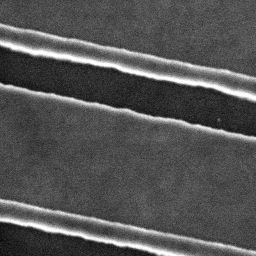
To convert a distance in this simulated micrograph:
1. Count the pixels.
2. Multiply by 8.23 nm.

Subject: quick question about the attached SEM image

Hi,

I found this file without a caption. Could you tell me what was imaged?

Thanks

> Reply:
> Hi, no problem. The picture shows lines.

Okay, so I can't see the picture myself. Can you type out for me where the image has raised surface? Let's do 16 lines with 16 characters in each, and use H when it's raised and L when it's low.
HHHHHHHHHHHHHHHH
HHHHHHHHHHHHHHHH
HHHHHHHHHHHHHHHH
LLLLHHHHHHHHHHHH
LLLLLLLLHHHHHHHH
HLLLLLLLLLLLLLHH
HHHHHHLLLLLLLLLL
HHHHHHHHHHHLLLLL
HHHHHHHHHHHHHHHL
HHHHHHHHHHHHHHHH
HHHHHHHHHHHHHHHH
HHHHHHHHHHHHHHHH
HHHHHHHHHHHHHHHH
HHHHHHHHHHHHHHHH
LLLLHHHHHHHHHHHH
LLLLLLLLLHHHHHHH